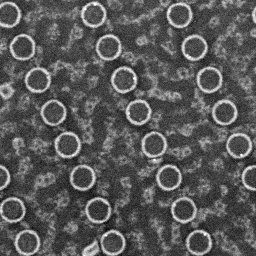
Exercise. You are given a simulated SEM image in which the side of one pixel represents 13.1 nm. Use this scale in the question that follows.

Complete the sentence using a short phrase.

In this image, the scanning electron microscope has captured a regular array of raised bodies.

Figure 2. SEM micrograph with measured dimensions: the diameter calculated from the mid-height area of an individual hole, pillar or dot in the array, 303 nanometres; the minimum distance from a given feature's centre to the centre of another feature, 35.9 px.